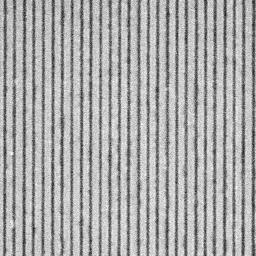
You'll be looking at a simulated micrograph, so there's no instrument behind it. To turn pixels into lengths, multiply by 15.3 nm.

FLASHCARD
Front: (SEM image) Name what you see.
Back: parallel lines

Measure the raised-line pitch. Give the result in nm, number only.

146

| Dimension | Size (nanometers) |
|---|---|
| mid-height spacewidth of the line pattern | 57.3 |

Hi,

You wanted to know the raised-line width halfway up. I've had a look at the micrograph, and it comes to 86 nm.